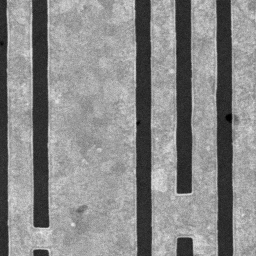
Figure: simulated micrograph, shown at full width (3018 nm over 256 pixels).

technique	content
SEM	groups of lines, slits or small figures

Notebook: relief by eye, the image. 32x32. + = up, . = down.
.+++..+++++++++++..+++..+++..+++
.+++..+++++++++++..+++..+++..+++
.+++..+++++++++++..+++..+++..+++
.+++..+++++++++++..+++..+++..+++
.+++..+++++++++++..+++..+++..+++
.+++..+++++++++++..+++..+++..+++
.+++..+++++++++++..+++..+++..+++
.+++..+++++++++++..+++..+++..+++
.+++..+++++++++++..+++..+++..+++
.+++..+++++++++++..+++..+++..+++
.+++..+++++++++++..+++..+++..+++
.+++..+++++++++++..+++..+++..+++
.+++..+++++++++++..+++..+++..+++
.+++..+++++++++++..+++..+++..+++
.+++..+++++++++++..+++..+++..+++
.+++..+++++++++++..+++..+++..+++
.+++..+++++++++++..+++..+++..+++
.+++..+++++++++++..+++..+++..+++
.+++..+++++++++++..+++..+++..+++
.+++..+++++++++++..+++..+++..+++
.+++..+++++++++++..+++..+++..+++
.+++..+++++++++++..+++..+++..+++
.+++..+++++++++++..+++..+++..+++
.+++..+++++++++++..+++..+++..+++
.+++..+++++++++++..++++++++..+++
.+++..+++++++++++..++++++++..+++
.+++..+++++++++++..++++++++..+++
.+++..+++++++++++..++++++++..+++
.++++.+++++++++++..++++++++..+++
.++++++++++++++++..++++++++..+++
.++++++++++++++++..+++..+++..+++
.+++..+++++++++++..+++..+++..+++